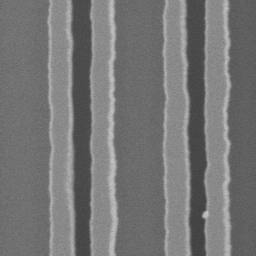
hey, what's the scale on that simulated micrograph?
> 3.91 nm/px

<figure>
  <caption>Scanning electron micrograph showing lines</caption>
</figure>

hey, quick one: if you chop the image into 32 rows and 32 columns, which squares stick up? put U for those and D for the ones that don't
DDDDDDUUUDDUUUDDDDDDDUUDDDUUUDDD
DDDDDDUUUDDUUUDDDDDDDUUDDDUUUDDD
DDDDDDUUUDDUUUDDDDDDUUUDDDUUDDDD
DDDDDDUUUDDUUUDDDDDDDUUDDDUUUDDD
DDDDDDUUUDDDUUDDDDDDDUUDDDUUUDDD
DDDDDDUUUDDDUUDDDDDDDUUDDDUUUDDD
DDDDDDUUUDDDUUDDDDDDUUUDDDUUUDDD
DDDDDDUUUDDUUUDDDDDDDUUDDDUUUDDD
DDDDDDUUUDDUUUDDDDDDDUUDDDUUDDDD
DDDDDDUUUDDUUUDDDDDDDUUDDDUUUDDD
DDDDDDUUUDDUUUDDDDDDDUUDDDUUUDDD
DDDDDDUUUDDUUUDDDDDDDUUDDDUUUDDD
DDDDDDUUUDDUUUDDDDDDDUUUDDUUUDDD
DDDDDDUUUDDUUUDDDDDDDUUUDDUUDDDD
DDDDDDUUUDDDUUDDDDDDDUUUDDUUDDDD
DDDDDDUUUDDDUUDDDDDDDUUUDDUUDDDD
DDDDDDUUUDDUUUDDDDDDDUUDDDUUUDDD
DDDDDDUUUDDUUUDDDDDDDUUUDDUUUDDD
DDDDDDDUUDDUUUDDDDDDUUUUDDUUUDDD
DDDDDDUUUDDUUUDDDDDDUUUUDDUUUDDD
DDDDDDUUUDDUUUDDDDDDDUUUDDUUUDDD
DDDDDDUUUDDUUUDDDDDDDUUUDDUUUDDD
DDDDDDUUUDDUUUDDDDDDDUUUDDUUUDDD
DDDDDDUUUDDUUUDDDDDDDUUUDDUUUDDD
DDDDDDUUUDDUUUDDDDDDDUUUDDUUUDDD
DDDDDDUUUDDUUUDDDDDDDUUUDDUUUDDD
DDDDDDUUUDDUUUDDDDDDDUUUDDUUUDDD
DDDDDDUUUDDUUUUDDDDDDUUUDDUUUDDD
DDDDDDUUUDDUUUUDDDDDDUUUDDUUUDDD
DDDDDDUUUDDUUUDDDDDDDUUUDDUUUDDD
DDDDDDUUUDDUUUDDDDDDDUUUDDUUUDDD
DDDDDDUUUDDUUUDDDDDDDUUUDDUUUDDD